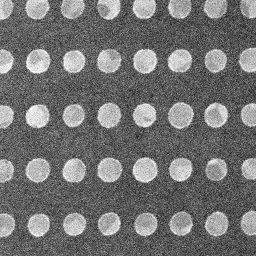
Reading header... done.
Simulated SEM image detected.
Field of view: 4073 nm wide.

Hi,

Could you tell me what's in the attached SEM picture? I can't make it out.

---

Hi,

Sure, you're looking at a regular array of raised bodies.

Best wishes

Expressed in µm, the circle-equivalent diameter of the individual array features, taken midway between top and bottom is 0.357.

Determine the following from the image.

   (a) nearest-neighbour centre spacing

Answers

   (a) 0.564 microns